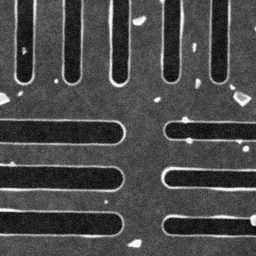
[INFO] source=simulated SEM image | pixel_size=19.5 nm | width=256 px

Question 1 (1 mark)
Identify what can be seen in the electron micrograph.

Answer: groups of lines, slits or small figures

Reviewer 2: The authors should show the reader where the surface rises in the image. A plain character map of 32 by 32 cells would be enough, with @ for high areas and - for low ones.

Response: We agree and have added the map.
@@--@@@@--@@@@--@@@@---@@@---@@@
@@--@@@@--@@@@--@@@@---@@@---@@@
@@--@@@@--@@@@--@@@@---@@@---@@@
@@--@@@@--@@@@--@@@@---@@@---@@@
@@--@@@@--@@@@--@@@@---@@@---@@@
@@--@@@@--@@@@--@@@@---@@@---@@@
@@--@@@@--@@@@--@@@@---@@@---@@@
@@--@@@@--@@@@--@@@@---@@@---@@@
@@--@@@@--@@@@--@@@@---@@@---@@@
@@--@@@@--@@@@--@@@@--@@@@--@@@@
@@@@@@@@@@@@@@@@@@@@@@@@@@@@@@@@
@@@@@@@@@@@@@@@@@@@@@@@@@@@@@@@@
@@@@@@@@@@@@@@@@@@@@@@@@@@@@@@@@
@@@@@@@@@@@@@@@@@@@@@@@@@@@@@@@@
@@@@@@@@@@@@@@@@@@@@@@@@@@@@@@@@
---------------@@@@@@-----------
----------------@@@@@-----------
---------------@@@@@@@@@--------
@@@@@@@@@@@@@@@@@@@@@@@@@@@@@@@@
@@@@@@@@@@@@@@@@@@@@@@@@@@@@@@@@
@@@@@@@@@@@@@@@@@@@@@@@@@@@@@@@@
---------------@@@@@@-----------
---------------@@@@@------------
---------------@@@@@@@@@@@@-----
@@@@@@@@@@@@@@@@@@@@@@@@@@@@@@@@
@@@@@@@@@@@@@@@@@@@@@@@@@@@@@@@@
----------@@@@@@@@@@@@@@@@@@@@@@
---------------@@@@@@----------@
---------------@@@@@------------
@@@@@@@@@@@---@@@@@@@@@@@@@-----
@@@@@@@@@@@@@@@@@@@@@@@@@@@@@@@@
@@@@@@@@@@@@@@@@@@@@@@@@@@@@@@@@